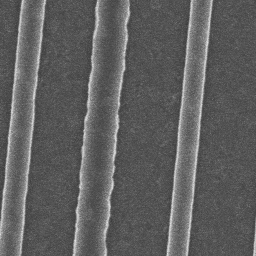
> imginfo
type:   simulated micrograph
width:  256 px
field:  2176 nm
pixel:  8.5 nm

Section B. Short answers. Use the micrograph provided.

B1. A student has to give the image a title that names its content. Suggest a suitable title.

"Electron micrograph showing one or a few lines or trenches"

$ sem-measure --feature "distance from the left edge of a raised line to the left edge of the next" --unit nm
716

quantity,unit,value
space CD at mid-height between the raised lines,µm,0.515